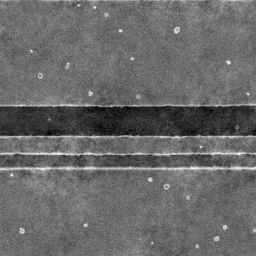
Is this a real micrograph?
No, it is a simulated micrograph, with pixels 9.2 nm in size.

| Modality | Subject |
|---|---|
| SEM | lines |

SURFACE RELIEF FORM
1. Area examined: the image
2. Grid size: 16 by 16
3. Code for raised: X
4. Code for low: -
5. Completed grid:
XXXXXXXXXXXXXXXX
XXXXXXXXXXXXXXXX
XXXXXXXXXXXXXXXX
XXXXXXXXXXXXXXXX
XXXXXXXXXXXXXXXX
XXXXXXXXXXXXXXXX
XXXXXXXXXXXXXXXX
----------------
-------X--------
XXXXXXXXXXXXXXXX
XXXXXXXXXXXXXXXX
XXXXXXXXXXXXXXXX
XXXXXXXXXXXXXXXX
XXXXXXXXXXXXXXXX
XXXXXXXXXXXXXXXX
XXXXXXXXXXXXXXXX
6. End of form